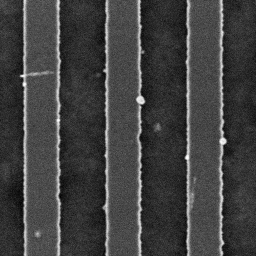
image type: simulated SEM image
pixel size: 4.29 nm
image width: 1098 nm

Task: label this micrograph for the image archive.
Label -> lines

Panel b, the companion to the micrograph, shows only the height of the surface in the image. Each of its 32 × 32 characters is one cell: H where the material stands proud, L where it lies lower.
LLLHHHHLLLLLLHHHHHLLLLLHHHHHLLLL
LLLHHHHLLLLLLHHHHHLLLLLHHHHHLLLL
LLLHHHHLLLLLLHHHHHLLLLLHHHHHLLLL
LLLHHHHLLLLLLHHHHHLLLLLHHHHHLLLL
LLLHHHHLLLLLLHHHHHLLLLLHHHHHLLLL
LLLHHHHLLLLLLHHHHHLLLLLHHHHHLLLL
LLLHHHHLLLLLLHHHHHLLLLLHHHHHLLLL
LLLHHHHHLLLLLHHHHHLLLLLHHHHHLLLL
LLLHHHHLLLLLLHHHHHLLLLLHHHHHLLLL
LLLHHHHLLLLLLHHHHHLLLLLHHHHHLLLL
LLLHHHHLLLLLLHHHHHLLLLLHHHHHLLLL
LLLHHHHLLLLLLHHHHHLLLLLHHHHHLLLL
LLLHHHHLLLLLLHHHHHLLLLLHHHHHLLLL
LLLHHHHLLLLLLHHHHHLLLLLHHHHHLLLL
LLLHHHHLLLLLLHHHHHLLLLLHHHHHLLLL
LLLHHHHLLLLLLHHHHHLLLLLHHHHHLLLL
LLLHHHHLLLLLLHHHHHLLLLLHHHHHLLLL
LLLHHHHLLLLLLHHHHLLLLLLHHHHHLLLL
LLLHHHHLLLLLLHHHHHLLLLLHHHHHLLLL
LLLHHHHLLLLLLHHHHHLLLLLHHHHHLLLL
LLLHHHHLLLLLLHHHHHLLLLLHHHHHLLLL
LLLHHHHHLLLLLHHHHHLLLLLHHHHHLLLL
LLLHHHHLLLLLLHHHHHLLLLLHHHHHLLLL
LLLHHHHLLLLLLHHHHHLLLLLHHHHHLLLL
LLLHHHHLLLLLLHHHHHLLLLLHHHHHLLLL
LLLHHHHHLLLLLHHHHHLLLLLHHHHHLLLL
LLLHHHHLLLLLLHHHHHLLLLLHHHHHLLLL
LLLHHHHLLLLLLHHHHHLLLLLHHHHHLLLL
LLLHHHHLLLLLLHHHHHLLLLLHHHHHLLLL
LLLHHHHLLLLLLHHHHHLLLLLHHHHHLLLL
LLLHHHHLLLLLLHHHHHLLLLLHHHHHLLLL
LLLHHHHLLLLLLHHHHHLLLLLHHHHHLLLL